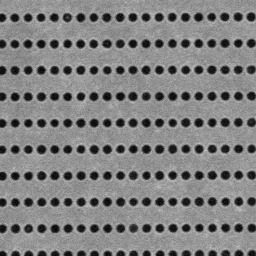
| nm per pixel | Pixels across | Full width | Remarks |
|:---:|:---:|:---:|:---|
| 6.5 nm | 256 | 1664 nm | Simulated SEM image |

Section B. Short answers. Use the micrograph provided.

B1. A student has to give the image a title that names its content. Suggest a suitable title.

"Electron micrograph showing a regular array of holes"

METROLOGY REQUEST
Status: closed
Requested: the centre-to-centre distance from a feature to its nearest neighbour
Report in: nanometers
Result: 84.7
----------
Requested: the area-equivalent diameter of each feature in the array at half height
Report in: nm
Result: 62.9